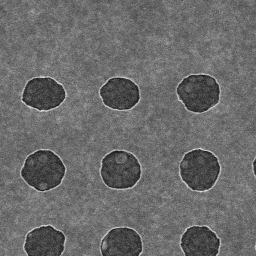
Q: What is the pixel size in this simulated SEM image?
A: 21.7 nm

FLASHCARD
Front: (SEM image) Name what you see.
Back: holes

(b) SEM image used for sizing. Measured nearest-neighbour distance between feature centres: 1670 nm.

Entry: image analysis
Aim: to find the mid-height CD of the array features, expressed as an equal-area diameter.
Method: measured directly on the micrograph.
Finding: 0.835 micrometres